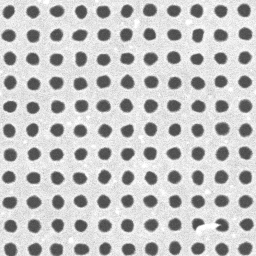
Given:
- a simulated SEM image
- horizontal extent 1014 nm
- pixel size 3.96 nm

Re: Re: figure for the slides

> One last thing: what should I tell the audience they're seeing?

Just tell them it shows a regular array of holes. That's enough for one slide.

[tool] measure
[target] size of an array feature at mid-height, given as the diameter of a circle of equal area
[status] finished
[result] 50 nm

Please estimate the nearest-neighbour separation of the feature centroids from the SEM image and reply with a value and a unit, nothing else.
90.8 nm